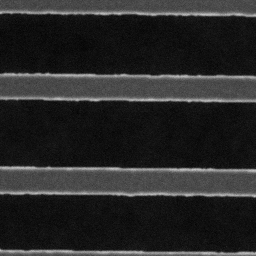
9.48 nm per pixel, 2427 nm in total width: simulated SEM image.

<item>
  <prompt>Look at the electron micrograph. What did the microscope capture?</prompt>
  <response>lines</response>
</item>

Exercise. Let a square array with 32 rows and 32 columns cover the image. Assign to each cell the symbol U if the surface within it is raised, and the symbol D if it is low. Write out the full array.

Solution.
UUUUUUUUUUUUUUUUUUUUUUUUUUUUUUUU
UUUUUUUUUUUUUUUUUUUUUUUUUUUUUUUU
DDDDDDDDDDDDDDDDDDDDDDDDDDDDDDDD
DDDDDDDDDDDDDDDDDDDDDDDDDDDDDDDD
DDDDDDDDDDDDDDDDDDDDDDDDDDDDDDDD
DDDDDDDDDDDDDDDDDDDDDDDDDDDDDDDD
DDDDDDDDDDDDDDDDDDDDDDDDDDDDDDDD
DDDDDDDDDDDDDDDDDDDDDDDDDDDDDDDD
DDDDDDDDDDDDDDDDDDDDDDDDDDDDDDDD
UUUUUUUUUUUUUUUUUUUDUUUUDDDDDDDD
UUUUUUUUUUUUUUUUUUUUUUUUUUUUUUUU
UUUUUUUUUUUUUUUUUUUUUUUUUUUUUUUU
DDDDDDDDDUDUUDDDUUUUUUUUUUUUUUUU
DDDDDDDDDDDDDDDDDDDDDDDDDDDDDDDD
DDDDDDDDDDDDDDDDDDDDDDDDDDDDDDDD
DDDDDDDDDDDDDDDDDDDDDDDDDDDDDDDD
DDDDDDDDDDDDDDDDDDDDDDDDDDDDDDDD
DDDDDDDDDDDDDDDDDDDDDDDDDDDDDDDD
DDDDDDDDDDDDDDDDDDDDDDDDDDDDDDDD
DDDDDDDDDDDDDDDDDDDDDDDDDDDDDDDD
DDDDDDDDDDDDDDDDDDDDDDDDDDDDDDDD
UUUUUUUUUUUUUUUUUUUUUUUUUUUUUUUU
UUUUUUUUUUUUUUUUUUUUUUUUUUUUUUUU
UUUUUUUUUUUUUUUUUUUUUUUUUUUUUUUU
DDDDDDDDDDDDDDDDDDDDDDDDDDDDDDDU
DDDDDDDDDDDDDDDDDDDDDDDDDDDDDDDD
DDDDDDDDDDDDDDDDDDDDDDDDDDDDDDDD
DDDDDDDDDDDDDDDDDDDDDDDDDDDDDDDD
DDDDDDDDDDDDDDDDDDDDDDDDDDDDDDDD
DDDDDDDDDDDDDDDDDDDDDDDDDDDDDDDD
DDDDDDDDDDDDDDDDDDDDDDDDDDDDDDDD
UUUUUUUUUUUUUUUUUUDDDDDDDDDDDDDD